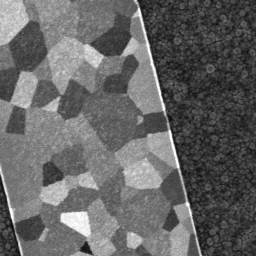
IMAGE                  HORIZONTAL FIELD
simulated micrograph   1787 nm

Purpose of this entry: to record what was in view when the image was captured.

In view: one or a few lines or trenches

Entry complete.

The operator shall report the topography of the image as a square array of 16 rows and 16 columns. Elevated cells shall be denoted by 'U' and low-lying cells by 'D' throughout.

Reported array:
UUUUUUUUUDDDDDDD
UUUUUUUUUDDDDDDD
UUUUUUUUUDDDDDDD
UUUUUUUUUDDDDDDD
UUUUUUUUUUDDDDDD
UUUUUUUUUUDDDDDD
UUUUUUUUUUDDDDDD
UUUUUUUUUUDDDDDD
UUUUUUUUUUUDDDDD
UUUUUUUUUUUDDDDD
UUUUUUUUUUUDDDDD
UUUUUUUUUUUDDDDD
UUUUUUUUUUUUDDDD
DUUUUUUUUUUUDDDD
DUUUUUUUUUUUDDDD
DUUUUUUUUUUUDDDD